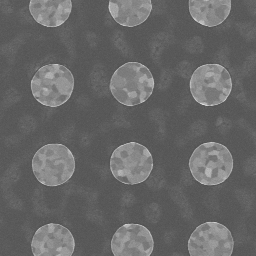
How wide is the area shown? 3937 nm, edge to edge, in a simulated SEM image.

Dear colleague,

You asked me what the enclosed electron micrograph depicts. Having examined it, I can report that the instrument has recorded raised bodies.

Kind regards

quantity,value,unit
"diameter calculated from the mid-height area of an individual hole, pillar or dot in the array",655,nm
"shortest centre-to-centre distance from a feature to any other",1210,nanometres